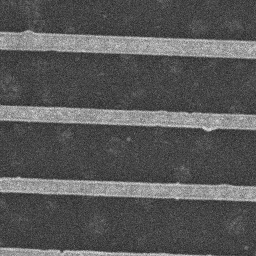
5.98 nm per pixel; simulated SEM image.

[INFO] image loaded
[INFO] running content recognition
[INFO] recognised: one or a few lines or trenches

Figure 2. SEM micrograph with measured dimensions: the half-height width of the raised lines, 0.0821 micrometres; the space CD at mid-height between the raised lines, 0.343 µm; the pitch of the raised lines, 431 nm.